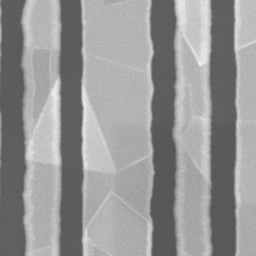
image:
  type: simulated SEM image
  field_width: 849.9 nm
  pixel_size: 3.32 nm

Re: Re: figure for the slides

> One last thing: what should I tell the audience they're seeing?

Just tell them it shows lines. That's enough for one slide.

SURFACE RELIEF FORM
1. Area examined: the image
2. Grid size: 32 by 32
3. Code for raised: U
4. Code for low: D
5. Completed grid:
DDDUUUUDDDUUUUUUUUUDDDUUUUDDDUUU
DDDUUUUDDDUUUUUUUUUDDDUUUUDDDUUU
DDDUUUUUDDUUUUUUUUUDDDUUUUDDDUUU
DDDUUUUUDDUUUUUUUUUDDDUUUUDDDUUU
DDDUUUUDDDUUUUUUUUUDDDUUUUDDDUUU
DDDUUUUDDDUUUUUUUUUDDDUUUUDDDUUU
DDDUUUUDDDUUUUUUUUUDDDUUUUDDDUUU
DDDUUUUDDDUUUUUUUUUDDDUUUUDDDUUU
DDDUUUUDDDUUUUUUUUUDDDUUUUDDDDUU
DDDUUUUDDDUUUUUUUUUDDDUUUUDDDDUU
DDDUUUUDDDUUUUUUUUUDDDUUUUDDDDUU
DDDUUUUDDDUUUUUUUUUDDDUUUUDDDDUU
DDDUUUUDDDUUUUUUUUUDDDUUUUDDDUUU
DDDUUUUDDDUUUUUUUUUDDDUUUUDDDDUU
DDDUUUUDDDUUUUUUUUUDDDUUUUDDDDUU
DDDUUUUDDDUUUUUUUUUDDDUUUUDDDDUU
DDDUUUUDDDUUUUUUUUUDDDUUUUDDDDUU
DDDUUUUDDDUUUUUUUUUDDDUUUUDDDDUU
DDDUUUUDDDUUUUUUUUUDDDUUUUDDDDUU
DDDUUUUUDDUUUUUUUUUDDDUUUUDDDDUU
DDDUUUUUDDUUUUUUUUUDDDUUUUDDDUUU
DDDUUUUUDDDUUUUUUUUDDDUUUUDDDUUU
DDDUUUUUDDUUUUUUUUUDDDUUUUDDDUUU
DDDUUUUUDDUUUUUUUUUDDDUUUUDDDUUU
DDDUUUUUDDUUUUUUUUUDDDUUUUDDDUUU
DDDUUUUDDDUUUUUUUUUDDDUUUUDDDUUU
DDDUUUUDDDUUUUUUUUUDDDUUUUDDDUUU
DDDUUUUDDDUUUUUUUUUDDDUUUUDDDDUU
DDDUUUUDDDUUUUUUUUUDDDUUUUDDDDUU
DDDUUUUDDDUUUUUUUUUDDDUUUUDDDDUU
DDDUUUUDDDUUUUUUUUUDDDUUUUDDDDUU
DDDUUUUDDDUUUUUUUUUDDDUUUUDDDUUU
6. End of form